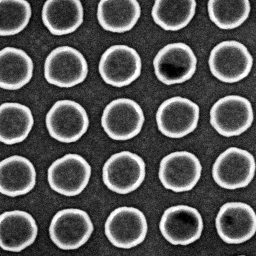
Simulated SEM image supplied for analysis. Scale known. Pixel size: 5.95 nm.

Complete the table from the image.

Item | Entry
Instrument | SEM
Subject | a regular array of raised bodies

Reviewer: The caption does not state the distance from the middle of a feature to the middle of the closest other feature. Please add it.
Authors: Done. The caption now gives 0.32 microns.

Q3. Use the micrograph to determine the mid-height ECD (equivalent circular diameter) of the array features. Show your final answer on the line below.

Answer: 234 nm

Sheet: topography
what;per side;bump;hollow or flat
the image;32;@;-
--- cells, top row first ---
@@@---@@@@---@@@@---@@@@--@@@@@-
@@@@-@@@@@--@@@@@--@@@@@--@@@@@-
@@@---@@@@---@@@@---@@@@---@@@--
@@@---@@@----@@@-----@----------
--------------------------------
----------------------------@@--
@@@----@@----@@@@---@@@@---@@@@-
@@@@--@@@@---@@@@---@@@@--@@@@@-
@@@@--@@@@@--@@@@--@@@@@--@@@@@-
@@@@--@@@@---@@@@---@@@@---@@@--
@@@----@@-----@@----------------
--------------------------------
---------------------@@-----@@--
@@@----@@@---@@@@---@@@@@--@@@@-
@@@@--@@@@@--@@@@@--@@@@@--@@@@-
@@@@--@@@@@--@@@@@--@@@@---@@@@-
@@@@--@@@@----@@@----@@-----@@--
@@------@-----------------------
--------------------------------
--------@-----@@@----@@@----@@@-
@@@@---@@@@--@@@@@--@@@@@--@@@@@
@@@@--@@@@@--@@@@@--@@@@@--@@@@@
@@@@--@@@@@--@@@@@--@@@@@--@@@@-
@@@@---@@@----@@@----@@@--------
--------------------------------
--------------------------------
--------@@----@@@----@@@----@@@@
@@@@---@@@@---@@@@--@@@@@--@@@@@
@@@@--@@@@@--@@@@@--@@@@@--@@@@@
@@@@--@@@@@---@@@@---@@@@---@@@-
@@@----@@@----@@@---------------
--------------------------------